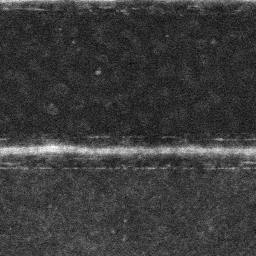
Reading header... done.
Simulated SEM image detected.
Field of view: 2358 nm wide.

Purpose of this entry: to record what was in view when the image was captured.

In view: one or a few lines or trenches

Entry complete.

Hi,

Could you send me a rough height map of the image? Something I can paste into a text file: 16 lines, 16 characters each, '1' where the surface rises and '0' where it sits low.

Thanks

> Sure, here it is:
0000000000000000
0000000000000000
0000000000000000
0000000000000000
0000000000000000
0000000000000000
0000000000000000
0000000000000000
0000000000000000
1111111111111111
1111111111111111
1111111111111111
1111111111111111
1111111111111111
1111111111111111
1111111111111111